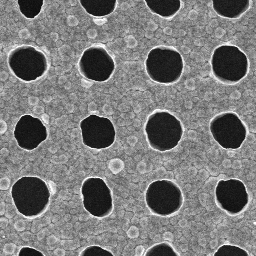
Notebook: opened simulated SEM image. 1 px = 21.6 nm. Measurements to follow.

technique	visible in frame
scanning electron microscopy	a regular array of holes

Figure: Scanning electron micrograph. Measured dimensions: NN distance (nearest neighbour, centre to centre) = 1400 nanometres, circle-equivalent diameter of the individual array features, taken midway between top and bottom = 744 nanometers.